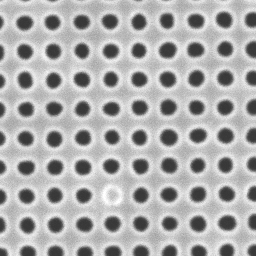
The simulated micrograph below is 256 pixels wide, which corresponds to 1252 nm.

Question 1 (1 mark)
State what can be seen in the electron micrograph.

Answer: a regular array of holes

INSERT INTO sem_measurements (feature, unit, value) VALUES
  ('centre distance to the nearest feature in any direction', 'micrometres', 0.138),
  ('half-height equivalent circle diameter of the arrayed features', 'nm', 78.8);